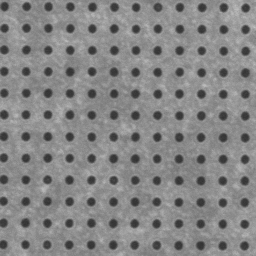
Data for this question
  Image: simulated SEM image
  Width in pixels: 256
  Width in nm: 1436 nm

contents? a regular array of holes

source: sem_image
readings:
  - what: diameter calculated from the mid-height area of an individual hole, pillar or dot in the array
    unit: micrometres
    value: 0.0559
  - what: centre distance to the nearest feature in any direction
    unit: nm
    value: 119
